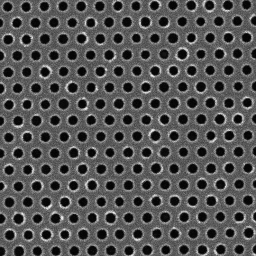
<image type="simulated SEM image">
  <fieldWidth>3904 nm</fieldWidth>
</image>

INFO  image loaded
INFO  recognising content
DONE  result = a regular array of holes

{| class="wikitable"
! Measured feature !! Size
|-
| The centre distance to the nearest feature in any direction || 276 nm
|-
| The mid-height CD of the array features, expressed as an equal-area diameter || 151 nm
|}